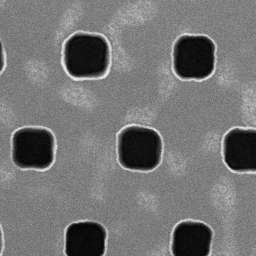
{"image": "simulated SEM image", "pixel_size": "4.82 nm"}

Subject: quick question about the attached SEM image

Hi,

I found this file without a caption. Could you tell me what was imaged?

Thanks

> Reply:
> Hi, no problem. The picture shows holes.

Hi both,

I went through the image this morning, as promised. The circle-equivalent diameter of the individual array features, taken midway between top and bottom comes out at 204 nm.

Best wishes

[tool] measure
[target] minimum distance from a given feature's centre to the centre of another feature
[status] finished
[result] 107 pixels